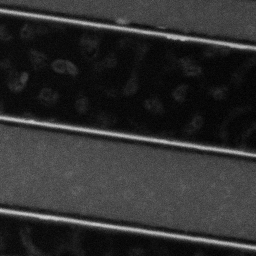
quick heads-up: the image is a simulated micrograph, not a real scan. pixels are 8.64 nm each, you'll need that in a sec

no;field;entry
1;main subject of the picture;one or a few lines or trenches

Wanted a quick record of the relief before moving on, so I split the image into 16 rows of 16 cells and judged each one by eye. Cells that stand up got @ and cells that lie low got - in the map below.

----------------
@@@@@@----------
@@@@@@@@@@@@@---
@@@@@@@@@@@@@@@@
@@@@@@@@@@@@@@@@
@@@@@@@@@@@@@@@@
@@@@@@@@@@@@@@@@
-@@@@@@@@@@@@@@@
--------@@@@@@@@
---------------@
----------------
----------------
----------------
@@@-------------
@@@@@@@@@-------
@@@@@@@@@@@@@@@@